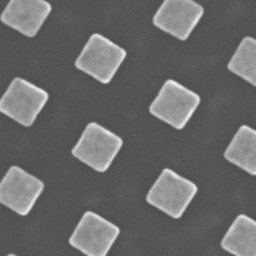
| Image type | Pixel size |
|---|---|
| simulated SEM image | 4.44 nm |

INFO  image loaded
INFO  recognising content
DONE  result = raised bodies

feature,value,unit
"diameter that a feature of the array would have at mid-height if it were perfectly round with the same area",191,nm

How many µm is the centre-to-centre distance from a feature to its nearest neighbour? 0.388